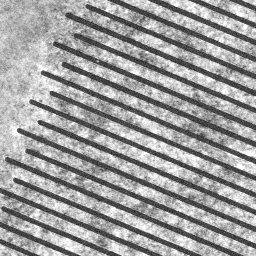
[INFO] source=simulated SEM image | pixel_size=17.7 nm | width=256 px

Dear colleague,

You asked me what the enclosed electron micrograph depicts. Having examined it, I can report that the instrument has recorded parallel lines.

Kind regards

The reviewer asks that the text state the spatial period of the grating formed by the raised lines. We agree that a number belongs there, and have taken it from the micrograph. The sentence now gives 0.275 um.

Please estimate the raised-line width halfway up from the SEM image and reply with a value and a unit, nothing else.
180 nanometres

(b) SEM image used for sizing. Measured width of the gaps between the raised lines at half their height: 0.0979 µm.